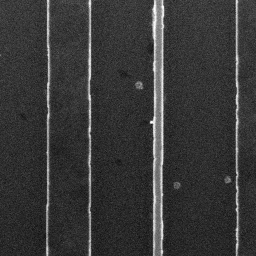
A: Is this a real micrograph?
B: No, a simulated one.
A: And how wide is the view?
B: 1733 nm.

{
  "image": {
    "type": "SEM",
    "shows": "lines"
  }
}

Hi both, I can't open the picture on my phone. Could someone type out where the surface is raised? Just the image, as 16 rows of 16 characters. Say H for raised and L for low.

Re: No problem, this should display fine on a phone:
LLLHHHLLLLLLLLLH
LLLHHHLLLLLLLLLH
LLLHHHLLLLLLLLLH
LLLHHHLLLLLLLLLH
LLLHHHLLLLLLLLLH
LLLHHHLLLLLLLLLH
LLLHHHLLLLLLLLLH
LLLHHHLLLLLLLLLH
LLLHHHLLLLLLLLLH
LLLHHHLLLLLLLLLH
LLLHHHLLLLLLLLLH
LLLHHHLLLLLLLLLH
LLLHHHLLLLLLLLLH
LLLHHHLLLLLLLLLH
LLLHHHLLLLLLLLLH
LLLHHHLLLLLLLLLH